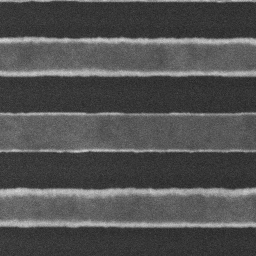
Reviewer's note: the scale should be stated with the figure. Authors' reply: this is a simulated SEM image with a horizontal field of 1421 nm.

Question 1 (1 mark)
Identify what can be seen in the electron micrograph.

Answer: lines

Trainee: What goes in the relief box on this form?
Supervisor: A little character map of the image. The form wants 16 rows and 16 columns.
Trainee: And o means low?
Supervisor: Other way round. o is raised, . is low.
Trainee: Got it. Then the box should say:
................
................
ooooooooooooo.oo
oooooooooooooooo
oooooooooooooooo
................
................
oooooooooooooooo
oooooooooooooooo
................
................
................
oooooooooooooooo
oooooooooooooooo
................
................